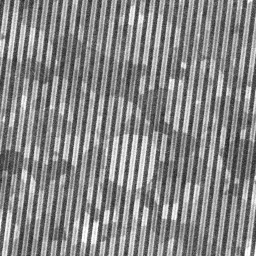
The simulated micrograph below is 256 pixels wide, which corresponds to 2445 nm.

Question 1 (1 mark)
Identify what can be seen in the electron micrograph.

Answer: parallel lines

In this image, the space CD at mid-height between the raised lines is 0.0569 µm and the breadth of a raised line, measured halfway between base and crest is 33.2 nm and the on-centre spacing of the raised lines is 92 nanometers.